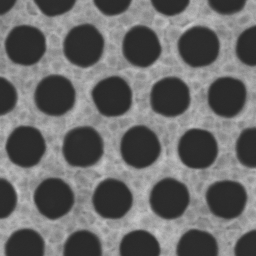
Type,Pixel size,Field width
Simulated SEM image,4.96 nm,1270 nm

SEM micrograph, a regular array of holes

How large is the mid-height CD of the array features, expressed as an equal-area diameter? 196 nm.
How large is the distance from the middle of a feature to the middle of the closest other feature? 284 nm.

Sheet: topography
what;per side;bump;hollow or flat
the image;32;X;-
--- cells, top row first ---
--XXX----XXX----XXX----XXX-----X
-XXXX---XXXXX--XXXXX---XXXX--XXX
XXXXXXXXXXXXXXXXXXXXXXXXXXXXXXXX
XX--XXXXX---XXXXX--XXXXX--XXXXX-
X----XXX-----XXX----XXX----XXX--
X-----XX-----XX-----XX-----XXX--
X-----XX-----XX-----XX-----XXX--
X----XXXX---XXXX---XXXX----XXX--
XXXXXXXXXXXXXXXXXXXXXXXXXXXXXXXX
XXXXXXXXXXXXXXXXXXXXXXXXXXXXXXXX
-XXXX----XXX----XXX----XXXX---XX
--XXX----XXX----XXX-----XX-----X
--XXX----XXX----XXX-----XX-----X
--XXX----XXX----XXX----XXXX---XX
XXXXXXXXXXXXXXXXXXXXXXXXXXXX-XXX
XXXXXXXXXXXXXXXXXXXXXXXXXXXXXXXX
XX---XXXX---XXXX---XXXX---XXXX--
X----XXX-----XX-----XX-----XXX--
X-----XX-----XX-----XX-----XXX--
X----XXX-----XX-----XX-----XXX--
XX--XXXXX---XXXX---XXXX---XXXXX-
XXXXXXXXXXXXXXXXXXXXXXXXXXXXXXXX
XXXXXX--XXXXX-XXXXXX--XXXXXXXXXX
--XXX----XXX----XXX----XXX----XX
--XX-----XXX----XXX-----XX-----X
--XX-----XXX----XXX----XXX-----X
-XXXX---XXXX----XXX----XXXX---XX
XXXXXXXXXXXXXXXXXXXXXXXXXXXXXXXX
XXXXXXXXXXXXXXXXXXXXXXXXXXXXXXXX
X----XXXX---XXXX---XXXX---XXXX--
X----XXX----XXX-----XX-----XXX--
X----XXX-----XX-----XX-----XX---